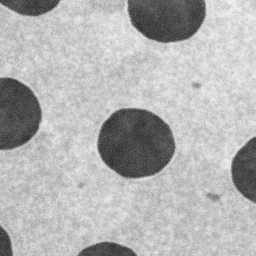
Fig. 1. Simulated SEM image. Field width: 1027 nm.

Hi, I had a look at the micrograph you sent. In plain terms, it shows holes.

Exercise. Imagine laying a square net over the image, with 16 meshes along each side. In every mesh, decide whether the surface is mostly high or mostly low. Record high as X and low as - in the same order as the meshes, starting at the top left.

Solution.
---XXXXX-----XXX
XXXXXXXX-----XXX
XXXXXXXXX---XXXX
XXXXXXXXXXXXXXXX
XXXXXXXXXXXXXXXX
--XXXXXXXXXXXXXX
---XXXXXXXXXXXXX
---XXXX---XXXXXX
--XXXX-----XXXXX
XXXXXX-----XXXX-
XXXXXXX---XXXX--
XXXXXXXXXXXXXXX-
XXXXXXXXXXXXXXX-
XXXXXXXXXXXXXXXX
XXXXXXXXXXXXXXXX
-XXXX---XXXXXXXX